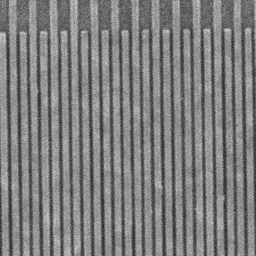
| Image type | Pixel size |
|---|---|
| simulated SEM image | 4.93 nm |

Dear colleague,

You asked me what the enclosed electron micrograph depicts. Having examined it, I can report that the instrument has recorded parallel lines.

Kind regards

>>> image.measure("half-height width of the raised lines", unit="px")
6.63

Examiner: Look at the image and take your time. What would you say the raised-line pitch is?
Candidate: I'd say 0.0505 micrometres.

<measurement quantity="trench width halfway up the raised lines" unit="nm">19.1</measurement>